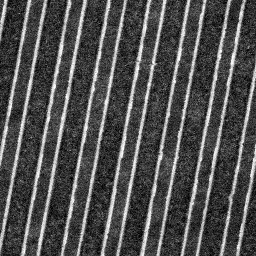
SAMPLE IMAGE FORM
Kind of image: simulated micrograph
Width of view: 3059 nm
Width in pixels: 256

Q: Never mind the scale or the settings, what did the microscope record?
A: parallel lines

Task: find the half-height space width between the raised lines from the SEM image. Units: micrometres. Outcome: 0.276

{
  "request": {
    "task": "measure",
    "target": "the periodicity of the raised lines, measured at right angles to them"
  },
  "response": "0.468 microns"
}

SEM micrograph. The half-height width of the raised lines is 188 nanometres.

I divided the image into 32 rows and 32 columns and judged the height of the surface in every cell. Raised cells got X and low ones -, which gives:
X---XX---XX--XXX---XX--XXX---X--
X--XX---XX---XX---XX---XX---XX--
---XX---XX---XX---XX---XX---XX--
---XX---XX---XX---XX---XX---XX--
---XX---XX---XX---XX---XX---XX--
---XX---XX---XX---XX---XX---XX--
--XXX---X---XXX--XX---XXX--XX---
--XX---XX---XX---XX---XX---XX---
--XX---XX---XX---XX---XX---XX---
--XX---XX---XX---XX---XX---XX---
--XX---XX---XX---XX---XX---XX---
--XX---XX--XXX--XXX--XXX---X---X
-XX---XX---XX---XX---XX---XX---X
-XX---XX---XX---XX---XX---XX---X
-XX---XX---XX---XX---XX---XX---X
-XX---XX---XX---XX---XX---XX---X
-XX---XX---XX---XX--XXX---XX--XX
XXX--XX---XXX--XX---XX---XX---XX
XX---XX---XX---XX---XX---XX---XX
XX---XX---XX---XX---XX---XX---XX
XX---XX---XX---XX---XX---XX---XX
XX---XX---XX---XX---XX---XX---XX
XX---XX--XXX--XXX--XXX--XX---XX-
X---XX---XX---XX---XX---XX---XX-
X---XX---XX---XX---XX---XX---XX-
X---XX---XX---XX---XX---XX---XX-
X---XX---XX---XX---XX---XX---XX-
X---XX---XX---XX---XX--XX---XXX-
---XX---XX---XX---XX---XX---XX--
---XX---XX---XX---XX---XX---XX--
---XX---XX---XX---XX---XX---XX--
---XX---XX---XX---XX---XX---XX--